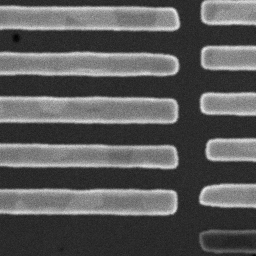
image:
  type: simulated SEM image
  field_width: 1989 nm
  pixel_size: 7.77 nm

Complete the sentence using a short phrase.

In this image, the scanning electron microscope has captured wiring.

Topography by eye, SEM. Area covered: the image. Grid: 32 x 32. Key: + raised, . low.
.........................+++++++
++++++++++++++++++++++...+++++++
++++++++++++++++++++++...+++++++
++++++++++++++++++++++..........
................................
................................
.........................+++++++
++++++++++++++++++++++...+++++++
++++++++++++++++++++++....++++++
................................
................................
................................
+++++++++++++++++++++....+++++++
++++++++++++++++++++++...+++++++
++++++++++++++++++++++..........
................................
................................
...............................+
++++++++++++++++++++++....++++++
++++++++++++++++++++++....++++++
++++++++++++++++++++++..........
................................
................................
..........................++++++
++++++++++++++++++++++...+++++++
++++++++++++++++++++++....++++++
++++++++++++++++++++++..........
................................
................................
.........................+++++++
.........................+++++++
................................